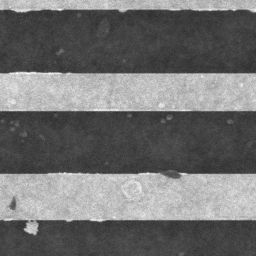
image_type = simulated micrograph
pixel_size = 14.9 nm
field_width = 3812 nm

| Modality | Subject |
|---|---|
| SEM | lines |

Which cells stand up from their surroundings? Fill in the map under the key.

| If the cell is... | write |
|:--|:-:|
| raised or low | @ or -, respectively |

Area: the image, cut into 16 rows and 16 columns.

@@@@@@@@@@@@@@@@
----------------
----------------
----------------
----------------
@@@@@@@@@@@@@@@@
@@@@@@@@@@@@@@@@
----------------
----------------
----------------
----------------
@@@@@@@@@@@@@@@@
@@@@@@@@@@@@@@@@
@@@@@@@@@@@@@@@@
----------------
----------------